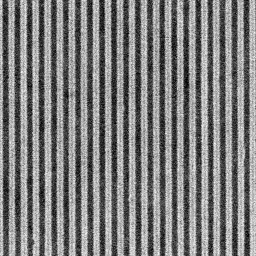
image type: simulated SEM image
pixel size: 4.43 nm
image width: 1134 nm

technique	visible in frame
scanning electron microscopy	parallel lines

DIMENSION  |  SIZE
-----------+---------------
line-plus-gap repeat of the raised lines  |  53.3 nm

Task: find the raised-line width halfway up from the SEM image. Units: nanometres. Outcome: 24.3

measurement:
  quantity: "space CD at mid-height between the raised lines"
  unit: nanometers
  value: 28.8